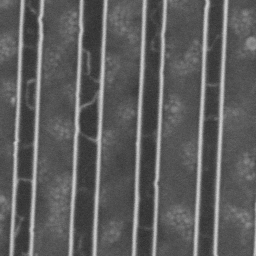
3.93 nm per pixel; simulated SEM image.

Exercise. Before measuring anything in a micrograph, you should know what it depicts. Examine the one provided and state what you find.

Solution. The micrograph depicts one or a few lines or trenches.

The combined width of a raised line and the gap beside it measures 241 nanometers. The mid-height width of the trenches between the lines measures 154 nm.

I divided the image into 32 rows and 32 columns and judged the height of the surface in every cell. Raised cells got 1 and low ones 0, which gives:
00011000001110000011100000110000
00011000001110000011100000110000
00011000001110000011100000110000
00011000001110000011000000110000
00011000001110000011000000110000
00111000001110000011000000110000
00011000001110000011000000110000
00011000001110000011000000110000
00111000001110000011000001110000
00111000001110000011000001110000
00111000001110000011000001110000
00111000001110000011000001110000
00111000001110000111000001110000
00111000001110000111000001110000
00111000001110000111000001110000
00111000001100000111000001110000
00111000001100000111000001110000
00111000011100000111000001100000
00111000011100000111000001100000
00110000011100000111000001100000
00110000011100000111000001100000
00110000011100000111000001100000
00110000011100000111000001100000
00110000011100000111000001100000
00110000011100000111000001100000
00110000011100000111000001100000
00110000011100000110000001100000
00110000011100000110000001100000
00110000011100000110000011100000
00110000011100000110000011100000
01110000011100000110000011100000
01110000011100000110000011100000